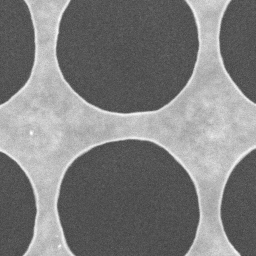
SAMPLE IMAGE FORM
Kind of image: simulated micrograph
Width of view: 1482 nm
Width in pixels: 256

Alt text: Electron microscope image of holes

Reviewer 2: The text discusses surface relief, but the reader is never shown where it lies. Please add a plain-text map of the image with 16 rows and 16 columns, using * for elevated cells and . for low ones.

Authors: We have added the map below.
..**........**..
..**........**..
..**........**..
..**........**..
..**........**..
.***.......****.
******....******
****************
****************
*****......*****
.***.......****.
..**........**..
..**........**..
..**........**..
..**........**..
..**........***.